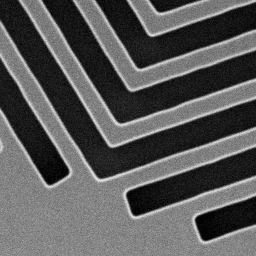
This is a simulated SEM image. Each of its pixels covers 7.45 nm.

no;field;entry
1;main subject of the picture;groups of lines, slits or small figures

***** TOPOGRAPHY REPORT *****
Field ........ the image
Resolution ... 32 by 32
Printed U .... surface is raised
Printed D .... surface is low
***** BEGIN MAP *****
DDDUUDDDDUUUDDDDUUUDDDDDUUUUUUUD
DDDUUUDDDDUUUDDDDUUUDUUUUUUUDDDD
DDDDUUUDDDDUUDDDDUUUUUUUUDDDDDDD
UDDDDUUDDDDUUUDDDDUUUUDDDDDDDDDD
UDDDDUUUDDDDUUUDDDDDDDDDDDDDDDUU
UUDDDDUUDDDDUUUDDDDDDDDDDDDUUUUU
UUDDDDUUUDDDDUUUDDDDDDDDUUUUUUUD
UUUDDDDUUUDDDDUUDDDDDUUUUUUUDDDD
DUUUDDDDUUDDDDUUUDUUUUUUUDDDDDDD
DDUUDDDDUUUDDDDUUUUUUUDDDDDDDDDD
DDUUUDDDDUUUDDDDUUUDDDDDDDDDDDUU
DDDUUDDDDDUUDDDDDDDDDDDDDDDUUUUU
DDDUUUDDDDUUUDDDDDDDDDDDUUUUUUUU
DDDDUUUDDDDUUDDDDDDDDDUUUUUUDDDD
UDDDDUUDDDDUUUDDDDDUUUUUUUDDDDDD
UDDDDUUUDDDDUUUUUUUUUUDDDDDDDDDD
UUDDDDUUDDDDUUUUUUUUDDDDDDDDDDUU
UUDDDDUUUDDDDUUUUDDDDDDDDDDUUUUU
UUUDDDDUUUDDDDDDDDDDDDDDUUUUUUUD
UUUUDDDDUUDDDDDDDDDDDUUUUUUUUDDD
UUUUDDDDUUUDDDDDDDDUUUUUUUDDDDDD
UUUUUDDDDUUUDDDDUUUUUUUDDDDDDDDD
UUUUUDDDUUUUUUUUUUUUDDDDDDDDDDDU
UUUUUUUUUUUUUUUUUDDDDDDDDDDDUUUU
UUUUUUUUUUUUUUUUDDDDDDDDDUUUUUUU
UUUUUUUUUUUUUUUUDDDDDDUUUUUUUDDD
UUUUUUUUUUUUUUUUDDDUUUUUUUDDDDDD
UUUUUUUUUUUUUUUUUUUUUUUUDDDDDDDD
UUUUUUUUUUUUUUUUUUUUUUUUUDDDDDDU
UUUUUUUUUUUUUUUUUUUUUUUUUDDDUUUU
UUUUUUUUUUUUUUUUUUUUUUUUUUUUUUUU
UUUUUUUUUUUUUUUUUUUUUUUUUUUUUUUU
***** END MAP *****